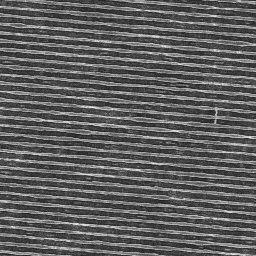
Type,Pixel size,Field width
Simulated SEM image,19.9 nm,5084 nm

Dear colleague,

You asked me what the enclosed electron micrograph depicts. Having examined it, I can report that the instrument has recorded parallel lines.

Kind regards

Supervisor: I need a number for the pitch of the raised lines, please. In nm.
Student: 167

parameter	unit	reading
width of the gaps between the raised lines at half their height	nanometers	124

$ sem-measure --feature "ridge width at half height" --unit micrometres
0.0519